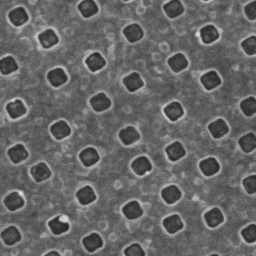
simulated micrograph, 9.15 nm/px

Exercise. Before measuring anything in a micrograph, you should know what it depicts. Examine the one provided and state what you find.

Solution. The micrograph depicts a regular array of holes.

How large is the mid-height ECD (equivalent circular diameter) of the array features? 181 nm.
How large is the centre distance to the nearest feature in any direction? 0.353 microns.